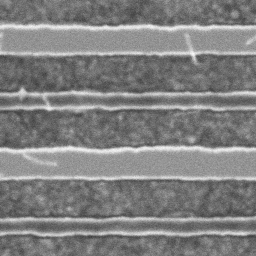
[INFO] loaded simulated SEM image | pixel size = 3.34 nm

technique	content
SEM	lines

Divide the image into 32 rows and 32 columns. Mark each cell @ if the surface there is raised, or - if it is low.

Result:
--------------------------------
--------------------------------
--------------------------------
@@@@@@@@@@@@@@@@@@@@@@@@@@@@@@@@
@@@@@@@@@@@@@@@@@@@@@@@@@@@@@@@@
@@@@@@@@@@@@@@@@@@@@@@@@@@@@@@@@
@@@@@@@@@@@@@@@@@@@@@@@@@@@@@@@@
--------------------------------
--------------------------------
--------------------------------
--------------------------------
--@------@----------------------
@@@@@@@@@@@@@@@@@@@@@@@@@@@@@@@@
@@@@@@@@@@@@@@@@@@@@@@@@@@@@@@@@
--------------------------------
--------------------------------
--------------------------------
--------------------------------
-------@@@-----@@@@@@@@@@@---@@@
@@@@@@@@@@@@@@@@@@@@@@@@@@@@@@@@
@@@@@@@@@@@@@@@@@@@@@@@@@@@@@@@@
@@@@@@@@@@@@@@@@@@@@@@@@@@@@@@@@
--------------------------------
--------------------------------
--------------------------------
--------------------------------
--------------------------------
@@@@@@@@@@@@@@@@@@@@@@@@@@@@@@@@
@@@@@@@@@@@@@@@@@@@@@@@@@@@@@@@@
--------------------------------
--------------------------------
--------------------------------